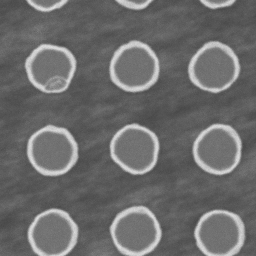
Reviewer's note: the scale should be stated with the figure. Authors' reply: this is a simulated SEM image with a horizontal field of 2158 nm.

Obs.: raised bodies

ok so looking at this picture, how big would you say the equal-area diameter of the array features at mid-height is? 0.382 microns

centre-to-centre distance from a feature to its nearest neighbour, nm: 690